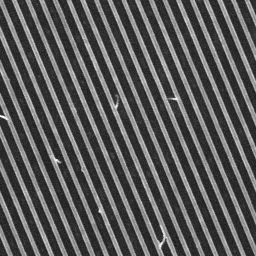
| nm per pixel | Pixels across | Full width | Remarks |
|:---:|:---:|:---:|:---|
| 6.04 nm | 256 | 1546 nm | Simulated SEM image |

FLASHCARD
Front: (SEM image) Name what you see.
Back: parallel lines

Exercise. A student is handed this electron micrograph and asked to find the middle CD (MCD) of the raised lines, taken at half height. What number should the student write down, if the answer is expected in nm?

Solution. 22.3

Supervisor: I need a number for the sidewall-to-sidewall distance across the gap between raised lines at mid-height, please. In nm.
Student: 50.9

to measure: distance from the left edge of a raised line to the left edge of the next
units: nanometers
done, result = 76.4